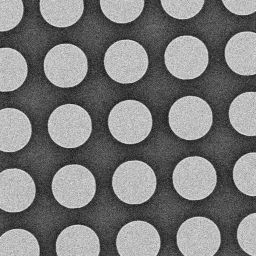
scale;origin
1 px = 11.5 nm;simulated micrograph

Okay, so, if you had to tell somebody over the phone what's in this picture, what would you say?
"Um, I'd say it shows an array of small figures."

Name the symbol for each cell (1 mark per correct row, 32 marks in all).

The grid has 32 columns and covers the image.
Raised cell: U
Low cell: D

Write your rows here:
UUUDDUUUUUDDDUUUUUDDUUUUUDDDUUUU
UUUDDUUUUUDDDUUUUUDDDUUUUDDDDUUU
UUUDDDUUUUDDDDUUUDDDDDDDDDDDDDDD
UUDDDDDDDDDDDDDDDDDDDDDDDDDDDDDD
DDDDDDDDDDDDDDDDDDDDDDDUDDDDDUUU
DDDDDDDDDDDDDDUUUDDDDUUUUDDDUUUU
UUDDDDUUUUDDDUUUUUDDDUUUUUDDUUUU
UUUDDDUUUUUDDUUUUUDDDUUUUUDDUUUU
UUUDDDUUUUUDDUUUUUDDDUUUUUDDDUUU
UUUDDDUUUUUDDDUUUUDDDDUUUDDDDDDD
UUUDDDDUUUDDDDDDDDDDDDDDDDDDDDDD
DDDDDDDDDDDDDDDDDDDDDDDDDDDDDDDD
DDDDDDDDDDDDDDDDDDDDDDUUUDDDDUUU
DDDDDDDUUUDDDDUUUUDDDUUUUUDDDUUU
UUUDDDUUUUUDDDUUUUUDDUUUUUDDDUUU
UUUUDDUUUUUDDDUUUUUDDUUUUUDDDUUU
UUUUDDUUUUUDDDUUUUUDDDUUUUDDDDUU
UUUUDDDUUUUDDDDUUUDDDDDDDDDDDDDD
UUUDDDDDDDDDDDDDDDDDDDDDDDDDDDDD
DDDDDDDDDDDDDDDDDDDDDDDDDDDDDDUU
DDDDDDDDDDDDDDDUUUDDDDUUUUDDDDUU
UUUDDDDUUUUDDDUUUUUDDDUUUUUDDUUU
UUUUDDDUUUUUDDUUUUUDDDUUUUUDDUUU
UUUUDDDUUUUUDDUUUUUDDDUUUUUDDDUU
UUUUDDDUUUUUDDDUUUUDDDDUUUDDDDDD
UUUUDDDDUUUDDDDDDDDDDDDDDDDDDDDD
DDDDDDDDDDDDDDDDDDDDDDDDDDDDDDDD
DDDDDDDDDDDDDDDDDDDDDDDUUUDDDDUU
DDDDDDDDUUUDDDDUUUUDDDUUUUUDDDUU
UUUUDDDUUUUUDDDUUUUUDDUUUUUDDDUU
UUUUUDDUUUUUDDDUUUUUDDUUUUUDDDUU
UUUUUDDUUUUUDDDUUUUUDDDUUUUDDDDU